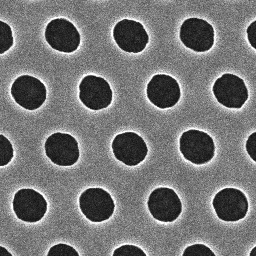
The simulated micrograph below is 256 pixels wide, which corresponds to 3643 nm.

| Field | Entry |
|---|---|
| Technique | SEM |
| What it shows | a regular array of holes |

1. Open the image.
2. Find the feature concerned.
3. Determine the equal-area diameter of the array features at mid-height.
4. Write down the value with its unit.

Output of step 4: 490 nanometres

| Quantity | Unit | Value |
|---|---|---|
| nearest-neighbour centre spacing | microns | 0.929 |